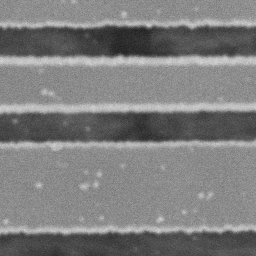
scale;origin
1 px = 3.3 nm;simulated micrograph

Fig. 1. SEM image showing lines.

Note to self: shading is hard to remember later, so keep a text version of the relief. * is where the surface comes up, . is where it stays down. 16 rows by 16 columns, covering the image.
****************
****************
................
................
****************
****************
****************
................
................
****************
****************
****************
****************
****************
********........
................